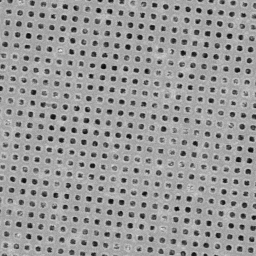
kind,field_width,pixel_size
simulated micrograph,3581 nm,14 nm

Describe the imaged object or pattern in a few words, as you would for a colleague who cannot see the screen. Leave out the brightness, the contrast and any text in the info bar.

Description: a regular array of holes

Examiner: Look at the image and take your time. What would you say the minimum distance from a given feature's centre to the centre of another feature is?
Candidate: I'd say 10.8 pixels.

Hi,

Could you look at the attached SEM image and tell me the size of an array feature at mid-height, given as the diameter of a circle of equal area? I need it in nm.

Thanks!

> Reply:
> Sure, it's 87.9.